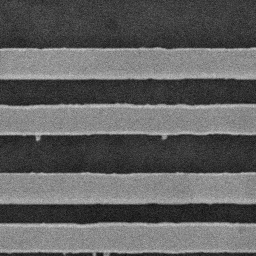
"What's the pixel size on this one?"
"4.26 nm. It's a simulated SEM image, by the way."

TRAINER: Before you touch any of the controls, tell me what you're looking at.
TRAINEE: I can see lines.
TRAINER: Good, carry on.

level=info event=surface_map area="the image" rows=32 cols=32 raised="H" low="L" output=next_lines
LLLLLLLLLLLLLLLLLLLLLLLLLLLLLLLL
LLLLLLLLLLLLLLLLLLLLLLLLLLLLLLLL
LLLLLLLLLLLLLLLLLLLLLLLLLLLLLLLL
LLLLLLLLLLLLLLLLLLLLLLLLLLLLLLLL
LLLLLLLLLLLLLLLLLLLLLLLLLLLLLLLL
LLLLLLLLLLLLLLLLLLLLLLLLLLLLLLLL
HHHHHHHHHHHHHHHHHHHHHHHHHHHHHHHH
HHHHHHHHHHHHHHHHHHHHHHHHHHHHHHHH
HHHHHHHHHHHHHHHHHHHHHHHHHHHHHHHH
HHHHHHHHHHHHHHHHHHHHHHHHHHHHHHHH
LLLLLLLLLLLLLLLLLLLLLLLLLLLLLLLL
LLLLLLLLLLLLLLLLLLLLLLLLLLLLLLLL
LLLLLLLLLLLLLLLLLLLLLLLLLLLLLLLL
HHHHHHHHHHHHHHHHHHHHHHHHHHHHHHHH
HHHHHHHHHHHHHHHHHHHHHHHHHHHHHHHH
HHHHHHHHHHHHHHHHHHHHHHHHHHHHHHHH
HHHHHHHHHHHHHHHHHHHHHHHHHHHHHHHH
LLLLLLLLLLLLLLLLLLLLLLLLLLLLLLLL
LLLLLLLLLLLLLLLLLLLLLLLLLLLLLLLL
LLLLLLLLLLLLLLLLLLLLLLLLLLLLLLLL
LLLLLLLLLLLLLLLLLLLLLLLLLLLLLLLL
LLLLLLLLLLLLLLLLLLLLLLLLLLLLLLLL
HHHHHHHHHHHHHHHHHHHHHHHHHHHHHHHH
HHHHHHHHHHHHHHHHHHHHHHHHHHHHHHHH
HHHHHHHHHHHHHHHHHHHHHHHHHHHHHHHH
LLLLLLLLLLLLLLLLLLLLLLLLLLLLLLLL
LLLLLLLLLLLLLLLLLLLLLLLLLLLLLLLL
LLLLLLLLLLLLLLLLLLLLLLLLLLLLLLLL
HHHHHHHHHHHHHHHHHHHHHHHHHHHHHHHH
HHHHHHHHHHHHHHHHHHHHHHHHHHHHHHHH
HHHHHHHHHHHHHHHHHHHHHHHHHHHHHHHH
HHHHHHHHHHHHHHHHHHHHHHHHHHHHHHHH